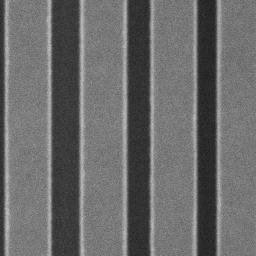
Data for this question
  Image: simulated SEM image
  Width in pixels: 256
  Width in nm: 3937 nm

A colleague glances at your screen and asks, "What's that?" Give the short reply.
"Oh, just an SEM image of lines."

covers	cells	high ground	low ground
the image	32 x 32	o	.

.ooooo....oooooo...oooooo..ooooo
.ooooo....oooooo...oooooo..ooooo
.ooooo....oooooo...oooooo..ooooo
.ooooo....oooooo...oooooo..ooooo
.ooooo....oooooo...oooooo..ooooo
.ooooo....oooooo...oooooo..ooooo
.ooooo....oooooo...oooooo..ooooo
.ooooo....oooooo...oooooo..ooooo
.ooooo....oooooo...oooooo..ooooo
.ooooo....oooooo...oooooo..ooooo
.ooooo....oooooo...oooooo..ooooo
.ooooo....oooooo...oooooo..ooooo
.ooooo....oooooo...oooooo..ooooo
.ooooo....oooooo...oooooo..ooooo
.ooooo....oooooo...oooooo..ooooo
.ooooo....oooooo...oooooo..ooooo
.ooooo....oooooo...oooooo..ooooo
.ooooo....oooooo...oooooo..ooooo
.ooooo....oooooo...oooooo..ooooo
.ooooo....oooooo...oooooo..ooooo
.ooooo....oooooo...oooooo..ooooo
.ooooo....oooooo...oooooo..ooooo
.ooooo....oooooo...oooooo..ooooo
.ooooo....oooooo...oooooo..ooooo
.ooooo....oooooo...oooooo..ooooo
.ooooo....oooooo...oooooo..ooooo
.ooooo....oooooo...oooooo..ooooo
.ooooo....oooooo...oooooo..ooooo
.ooooo....oooooo...oooooo..ooooo
.ooooo....oooooo...oooooo..ooooo
.ooooo....oooooo...oooooo..ooooo
.ooooo....oooooo...oooooo..ooooo